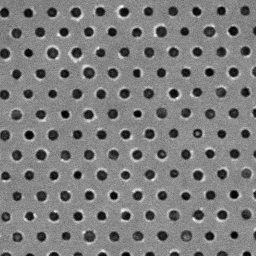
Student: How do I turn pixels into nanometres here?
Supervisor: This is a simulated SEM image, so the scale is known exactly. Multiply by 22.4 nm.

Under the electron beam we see a regular array of holes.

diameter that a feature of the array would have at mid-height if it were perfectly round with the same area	230	nanometers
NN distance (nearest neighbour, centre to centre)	520	nm